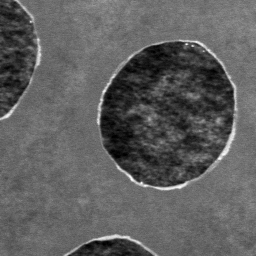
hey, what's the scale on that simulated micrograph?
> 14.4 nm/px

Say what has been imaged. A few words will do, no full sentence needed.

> holes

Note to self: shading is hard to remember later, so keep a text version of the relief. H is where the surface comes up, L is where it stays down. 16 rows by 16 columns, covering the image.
LHHHHHHHHHHHHHHH
LLHHHHHHHHHHHHHH
LLHHHHHHHHHHHHHH
LLHHHHHHLLLLLHHH
LLHHHHHLLLLLLLHH
LLHHHHHLLLLLLLLH
LHHHHHLLLLLLLLLH
HHHHHHLLLLLLLLLH
HHHHHHLLLLLLLLHH
HHHHHHHLLLLLLLHH
HHHHHHHHLLLLLHHH
HHHHHHHHHLLHHHHH
HHHHHHHHHHHHHHHH
HHHHHHHHHHHHHHHH
HHHHHHHHHHHHHHHH
HHHHHLLLLHHHHHHH